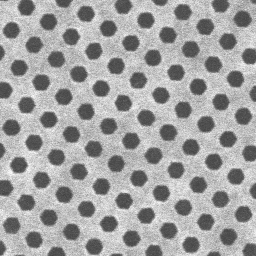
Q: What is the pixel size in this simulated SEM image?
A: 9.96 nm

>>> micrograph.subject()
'a regular array of holes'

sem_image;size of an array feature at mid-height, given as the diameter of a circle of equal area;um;0.174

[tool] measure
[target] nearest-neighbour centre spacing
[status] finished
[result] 266 nm